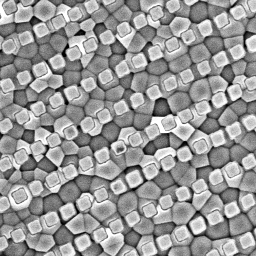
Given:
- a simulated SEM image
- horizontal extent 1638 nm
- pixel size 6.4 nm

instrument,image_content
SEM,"a regular array of raised bodies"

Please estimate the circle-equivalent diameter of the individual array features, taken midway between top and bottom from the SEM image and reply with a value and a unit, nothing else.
0.0838 microns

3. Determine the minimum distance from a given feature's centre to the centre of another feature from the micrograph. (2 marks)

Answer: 86.7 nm